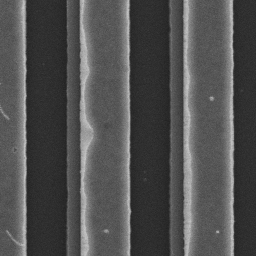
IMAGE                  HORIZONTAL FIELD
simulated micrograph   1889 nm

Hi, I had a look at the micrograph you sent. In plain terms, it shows lines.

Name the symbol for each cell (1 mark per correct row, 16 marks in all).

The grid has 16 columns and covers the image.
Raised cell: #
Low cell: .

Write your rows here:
##...###....###.
##...###...####.
##...###....###.
##...###....###.
##...###....###.
##...###....###.
##...###....###.
##...###....###.
##...###....###.
##...###....###.
##...###....###.
##...###....###.
##...###....###.
##...###....###.
##...###....###.
##...###....###.